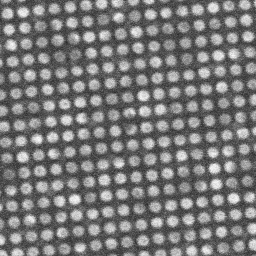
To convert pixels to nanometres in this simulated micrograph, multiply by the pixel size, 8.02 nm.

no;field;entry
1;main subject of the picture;a regular array of raised bodies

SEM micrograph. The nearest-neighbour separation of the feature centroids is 125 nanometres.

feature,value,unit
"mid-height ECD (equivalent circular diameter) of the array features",77.8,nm